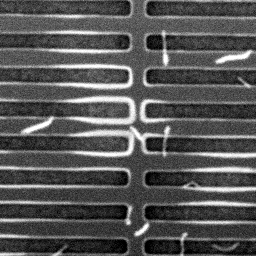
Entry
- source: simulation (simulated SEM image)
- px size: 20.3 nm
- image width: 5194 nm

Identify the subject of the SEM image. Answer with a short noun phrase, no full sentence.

groups of lines, slits or small figures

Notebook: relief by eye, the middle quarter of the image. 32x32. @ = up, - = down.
@@@--------@@@@@@@@@@@@@@@@@@@@@
----------------@@@@@-----------
-----------------@@@------------
-----------------@@@------------
-----------------@@@------------
@@@@@@@@@@--@@@@@@@@@@@@@@@@@@@@
@@@@@@@@@@@@@@@@@@@@@@@@@@@@@@@@
@@@@@@@@@@@@@@@@@@@@@@@@@@@@@@@@
@@@@@@@@@@@@@@@@@@@@@@@@@@@@@@@@
-----------------@@@@---@@@@@@@@
-----------------@@@------------
-----------------@@@------------
-----------------@@@------------
@@---------------@@@------------
@@@@@@@@@@@@@@@@@@@@@@@@@@@@@@@@
@@@@@@@@@@@@@@@@@@@@@@@@@@@@@@@@
@@@@@@@@@@@@@@@@@@@@@@@@@@@@@@@@
@@@@@-----------@@@@@@@@@@@@@@@@
-----------------@@@------------
-----------------@@@------------
-----------------@@@------------
----------------@@@@------------
@@@@@@@--------@@@@@@@@@@@@@@@--
@@@@@@@@@@@@@@@@@@@@@@@@@@@@@@@@
@@@@@@@@@@@@@@@@@@@@@@@@@@@@@@@@
@@@@@@@@@@@@@@@@@@@@@@@@@@@@@@@@
---------------@@@@@@@@@@@@@@@@@
----------------@@@@------------
----------------@@@@------------
----------------@@@@------------
---------------@@@@@@---------@-
@@@@@@@@@@@@@@@@@@@@@@@@@@@@@@@@